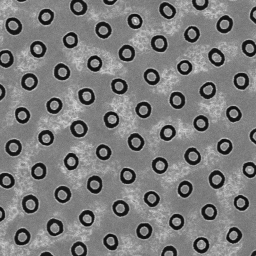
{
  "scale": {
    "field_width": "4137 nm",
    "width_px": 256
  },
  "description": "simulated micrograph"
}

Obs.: a regular array of ring-shaped grooves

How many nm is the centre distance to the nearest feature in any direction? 535